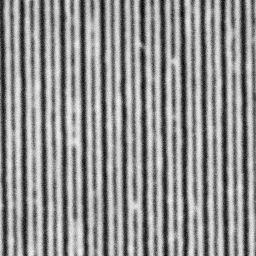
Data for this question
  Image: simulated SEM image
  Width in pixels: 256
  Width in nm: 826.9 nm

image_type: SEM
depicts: parallel lines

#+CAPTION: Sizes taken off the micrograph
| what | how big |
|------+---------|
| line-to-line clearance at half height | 16.9 nm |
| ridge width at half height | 0.0198 µm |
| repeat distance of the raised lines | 32.4 nm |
